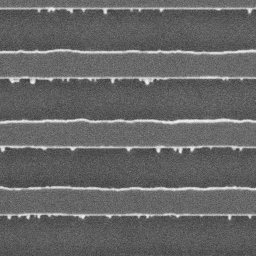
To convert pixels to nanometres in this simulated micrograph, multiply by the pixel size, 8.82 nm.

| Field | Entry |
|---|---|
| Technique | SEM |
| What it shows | lines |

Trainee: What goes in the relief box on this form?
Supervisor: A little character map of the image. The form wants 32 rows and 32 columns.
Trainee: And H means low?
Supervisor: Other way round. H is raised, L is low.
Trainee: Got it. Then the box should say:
HHHHHHHHHHHHHHHHHHHHHHHHHHHHHHHH
LLLLLLLLLLLLLLLLLLLLLLLLLLLLLLLL
LLLLLLLLLLLLLLLLLLLLLLLLLLLLLLLL
LLLLLLLLLLLLLLLLLLLLLLLLLLLLLLLL
LLLLLLLLLLLLLLLLLLLLLLLLLLLLLLLL
LLLLLLLLLLLLLLLLLLLLLLLLLLLLLLLL
LHHHHHHHHHHHHLHHHHHHHHHHLLLLHHHH
HHHHHHHHHHHHHHHHHHHHHHHHHHHHHHHH
HHHHHHHHHHHHHHHHHHHHHHHHHHHHHHHH
HHHHHHHHHHHHHHHHHHHHHHHHHHHHHHHH
LLLLLLLLLLLLLLLLLLLLLLLLLLLLLLLL
LLLLLLLLLLLLLLLLLLLLLLLLLLLLLLLL
LLLLLLLLLLLLLLLLLLLLLLLLLLLLLLLL
LLLLLLLLLLLLLLLLLLLLLLLLLLLLLLLL
LLLLLLLLLLLLLLLLLLLLLLLLLLLLLLLL
HHHHHHHHHHHHHHHHHHHHHHHHHHHHHHHH
HHHHHHHHHHHHHHHHHHHHHHHHHHHHHHHH
HHHHHHHHHHHHHHHHHHHHHHHHHHHHHHHH
HLLLLLLLLLLLLLLLLLLHLLHHLLLLLLLL
LLLLLLLLLLLLLLLLLLLLLLLLLLLLLLLL
LLLLLLLLLLLLLLLLLLLLLLLLLLLLLLLL
LLLLLLLLLLLLLLLLLLLLLLLLLLLLLLLL
LLLLLLLLLLLLLLLLLLLLLLLLLLLLLLLL
HLLHHHHHHHHHLLLLHHLLLLLHHLHHHHHL
HHHHHHHHHHHHHHHHHHHHHHHHHHHHHHHH
HHHHHHHHHHHHHHHHHHHHHHHHHHHHHHHH
HHHHHHHHHHHHHHHHHHHHHHHHHHHHHHHH
LLLLLLLLLLLLLLLLLLLLLLLLLLLLLLLL
LLLLLLLLLLLLLLLLLLLLLLLLLLLLLLLL
LLLLLLLLLLLLLLLLLLLLLLLLLLLLLLLL
LLLLLLLLLLLLLLLLLLLLLLLLLLLLLLLL
LLLLLLLLLLLLLLLLLLLLLLLLLLLLLLLL